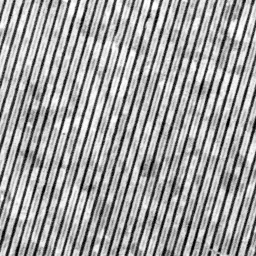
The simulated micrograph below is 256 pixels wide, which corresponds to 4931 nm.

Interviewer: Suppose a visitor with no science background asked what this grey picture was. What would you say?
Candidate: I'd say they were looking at parallel lines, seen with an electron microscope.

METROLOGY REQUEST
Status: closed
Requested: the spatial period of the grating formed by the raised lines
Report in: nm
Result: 170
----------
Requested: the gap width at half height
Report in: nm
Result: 92.6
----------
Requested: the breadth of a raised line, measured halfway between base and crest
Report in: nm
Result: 74.1